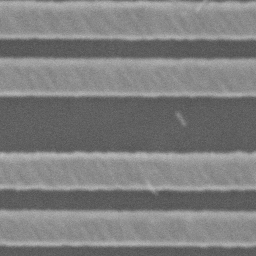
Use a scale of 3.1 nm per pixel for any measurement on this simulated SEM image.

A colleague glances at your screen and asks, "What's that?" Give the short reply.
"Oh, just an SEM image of lines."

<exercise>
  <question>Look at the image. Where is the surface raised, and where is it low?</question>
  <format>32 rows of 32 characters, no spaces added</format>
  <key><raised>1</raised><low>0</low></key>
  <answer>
11111111111111111111111001101111
11111111111111111111111111111111
11111111111111111111111111111111
11111111111111111111111111111111
11111111111111111111111111111111
00000000000000000000000000000000
00000000000000000000000000000000
11111111111000000011100110001000
11111111111111111111111111111111
11111111111111111111111111111111
11111111111111111111111111111111
11111111111111111111111111111111
00000000000000000000000000000000
00000000000000000000000000000000
00000000000000000000000000000000
00000000000000000000000000000000
00000000000000000000000000000000
00000000000000000000000000000000
00000000000000000000000000000000
11111111111111111111111111111111
11111111111111111111111111111111
11111111111111111111111111111111
11111111111111111111111111111111
11111111111111111111111111111111
00000000000000000000000000000000
00000000000000000000000000000000
10000000000000000000001000000000
11111111111111111111111111111111
11111111111111111111111111111111
11111111111111111111111111111111
11111111111111111111111111111111
00000000000000000000000000000000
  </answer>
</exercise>